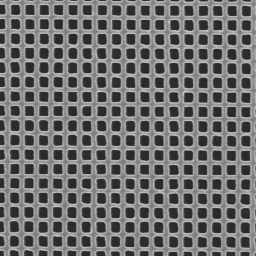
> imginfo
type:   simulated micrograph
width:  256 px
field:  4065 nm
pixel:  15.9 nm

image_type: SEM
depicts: a regular array of holes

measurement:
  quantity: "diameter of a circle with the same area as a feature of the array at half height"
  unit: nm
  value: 173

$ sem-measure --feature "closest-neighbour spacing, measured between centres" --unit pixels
14